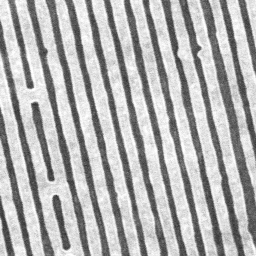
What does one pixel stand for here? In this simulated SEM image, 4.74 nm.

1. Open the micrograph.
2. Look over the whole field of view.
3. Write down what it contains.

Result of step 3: parallel lines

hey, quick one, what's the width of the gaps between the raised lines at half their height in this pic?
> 39.9 nm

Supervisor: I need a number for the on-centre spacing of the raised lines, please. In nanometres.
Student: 89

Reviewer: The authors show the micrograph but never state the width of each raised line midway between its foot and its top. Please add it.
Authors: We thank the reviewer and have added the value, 48.5 nanometres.